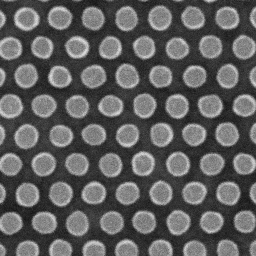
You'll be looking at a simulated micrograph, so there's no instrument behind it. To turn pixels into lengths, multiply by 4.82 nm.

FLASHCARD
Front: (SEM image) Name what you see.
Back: a regular array of raised bodies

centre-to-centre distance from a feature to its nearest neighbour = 158 nm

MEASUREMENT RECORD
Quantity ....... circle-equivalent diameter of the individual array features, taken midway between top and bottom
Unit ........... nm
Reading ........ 107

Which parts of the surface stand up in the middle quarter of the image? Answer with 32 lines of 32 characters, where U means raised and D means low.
DDDDDDDUUDDDDDUUUDDDDDDDDDDDDDDD
UDDDDUUUUUDDDDUUUUDDDDUUUUDDDDDU
UDDDUUUUUUDDDUUUUUDDDDUUUUUDDDUU
UUDDUUUUUUDDDUUUUUDDDDUUUUUDDDUU
UUDDDUUUUUDDDDUUUUDDDDUUUUUDDDUU
DDDDDDUUUDDDDDUUUUDDDDDUUDDDDDDD
DDDDDDDDDDDDDDDDDDDDDDDDDDDDDDDD
DDDDDDDDDDDDDDDDDDDDDDDDDDDDDDDD
DDUUUDDDDDUUUDDDDDUUUUDDDDUUUUDD
DUUUUUDDDUUUUUDDDDUUUUUDDDUUUUUD
DUUUUUDDDUUUUUDDDUUUUUUDDDUUUUUD
DUUUUUDDDUUUUUDDDDUUUUUDDDUUUUUD
DUUUUUDDDDUUUUDDDDUUUUDDDDUUUUDD
DDDDDDDDDDDDDDDDDDDDDDDDDDDDUDDD
DDDDDDDDDDDDDDDDDDDDDDDDDDDDDDDD
DDDDDDUUUDDDDDDUUDDDDDUUUUDDDDDU
UUDDDUUUUUDDDDUUUUDDDDUUUUDDDDUU
UUDDDUUUUUDDDUUUUUUDDDUUUUUDDDUU
UUDDDUUUUUDDDUUUUUUDDDUUUUUDDDUU
UUDDDDUUUUDDDDUUUUDDDDUUUUDDDDDU
DDDDDDDDDDDDDDDDDDDDDDDDUDDDDDDD
DDDDDDDDDDDDDDDDDDDDDDDDDDDDDDDD
DDUDDDDDDDDDDDDDDDDUUDDDDDDUUUDD
DUUUUDDDDUUUUUDDDUUUUUDDDDUUUUUD
DUUUUUDDDUUUUUDDDUUUUUDDDDUUUUUD
DUUUUUDDDUUUUUDDDUUUUUDDDDUUUUUD
DUUUUUDDDUUUUUDDDDUUUUDDDDUUUUUD
DDDUUDDDDDUUUDDDDDUUUDDDDDDUUUDD
DDDDDDDDDDDDDDDDDDDDDDDDDDDDDDDD
DDDDDDDDDDDDDDDDDDDDDDDUUDDDDDDD
UDDDDDUUUUDDDDUUUUDDDDUUUUDDDDDU
UUDDDUUUUUDDDUUUUUDDDDUUUUUDDDUU